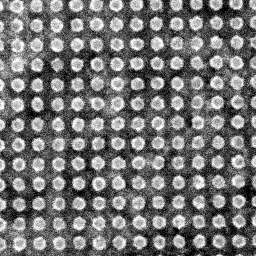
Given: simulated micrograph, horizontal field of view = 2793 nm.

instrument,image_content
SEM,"a regular array of raised bodies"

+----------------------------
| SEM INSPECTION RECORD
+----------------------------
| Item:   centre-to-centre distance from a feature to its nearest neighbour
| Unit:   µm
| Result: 0.213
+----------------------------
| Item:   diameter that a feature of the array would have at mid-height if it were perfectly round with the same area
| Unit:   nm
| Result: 125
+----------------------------